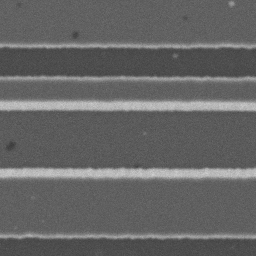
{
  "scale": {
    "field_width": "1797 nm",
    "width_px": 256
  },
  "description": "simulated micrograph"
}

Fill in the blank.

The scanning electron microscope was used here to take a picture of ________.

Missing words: lines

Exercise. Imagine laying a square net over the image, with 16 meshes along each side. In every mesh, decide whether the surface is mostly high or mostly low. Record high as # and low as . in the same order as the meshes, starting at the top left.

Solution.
################
################
################
................
................
################
################
................
................
................
................
################
################
################
################
................